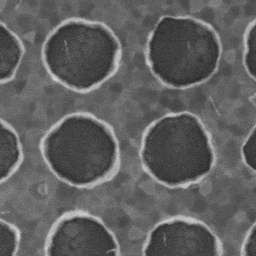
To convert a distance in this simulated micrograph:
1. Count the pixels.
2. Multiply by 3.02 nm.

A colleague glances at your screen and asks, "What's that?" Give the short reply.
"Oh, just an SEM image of holes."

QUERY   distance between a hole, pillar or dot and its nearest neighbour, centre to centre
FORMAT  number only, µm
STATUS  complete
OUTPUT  0.29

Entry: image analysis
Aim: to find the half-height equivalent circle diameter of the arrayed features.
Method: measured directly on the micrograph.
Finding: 217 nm